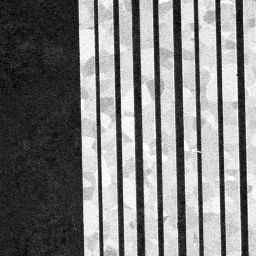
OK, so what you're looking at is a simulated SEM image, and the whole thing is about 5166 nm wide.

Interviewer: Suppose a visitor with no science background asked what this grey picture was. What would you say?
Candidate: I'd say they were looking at parallel lines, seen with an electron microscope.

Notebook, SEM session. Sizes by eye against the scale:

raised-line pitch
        408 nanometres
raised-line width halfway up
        0.272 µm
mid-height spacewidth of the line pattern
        0.131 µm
